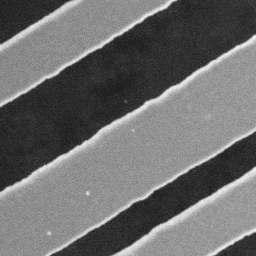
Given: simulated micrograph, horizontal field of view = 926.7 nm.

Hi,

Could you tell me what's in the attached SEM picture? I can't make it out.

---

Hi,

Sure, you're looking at lines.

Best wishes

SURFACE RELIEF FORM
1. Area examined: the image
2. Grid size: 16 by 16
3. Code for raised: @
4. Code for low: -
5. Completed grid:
----@@@@@@------
--@@@@@@@-------
-@@@@@@---------
@@@@@---------@@
@@@@--------@@@@
@@---------@@@@@
---------@@@@@@@
-------@@@@@@@@@
------@@@@@@@@@-
----@@@@@@@@@@--
---@@@@@@@@@----
-@@@@@@@@@----@@
@@@@@@@@@----@@@
@@@@@@@----@@@@@
@@@@@@---@@@@@@@
@@@@----@@@@@@--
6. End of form